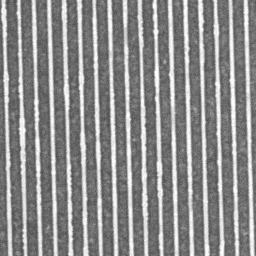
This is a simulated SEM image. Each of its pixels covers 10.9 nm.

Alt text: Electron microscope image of parallel lines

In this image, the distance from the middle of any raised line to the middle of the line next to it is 166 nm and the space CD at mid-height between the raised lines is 137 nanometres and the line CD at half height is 21.9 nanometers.